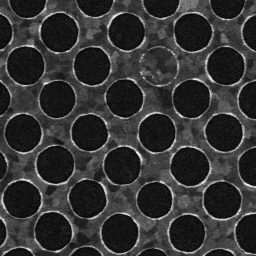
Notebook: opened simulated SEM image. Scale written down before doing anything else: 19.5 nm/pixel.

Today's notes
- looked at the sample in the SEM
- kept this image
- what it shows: a regular array of holes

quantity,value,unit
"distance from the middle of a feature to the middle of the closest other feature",0.907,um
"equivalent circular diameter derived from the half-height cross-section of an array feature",743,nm